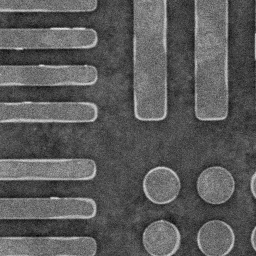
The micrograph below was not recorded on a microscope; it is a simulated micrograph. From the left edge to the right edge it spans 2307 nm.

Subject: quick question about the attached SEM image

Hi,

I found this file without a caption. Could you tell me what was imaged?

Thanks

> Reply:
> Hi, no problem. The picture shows groups of lines, slits or small figures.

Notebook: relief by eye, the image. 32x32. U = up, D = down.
UUUUUUUUUUUUDDDDDUUUUDDDDUUUDDDD
DDDDDDDDDDDDDDDDDUUUUDDDDUUUDDDD
DDDDDDDDDDDDDDDDDUUUUDDDDUUUDDDD
DDDDDDDDDDDDDDDDDUUUUDDDDUUUDDDD
UUUUUUUUUUUUDDDDDUUUDDDDUUUUDDDD
UUUUUUUUUUUUDDDDDUUUUDDDUUUUDDDD
DDDDDDDDDDDDDDDDDUUUUDDDUUUUDDDD
DDDDDDDDDDDDDDDDDUUUUDDDUUUUDDDD
UUUUUUUUUUUUDDDDDUUUUDDDDUUUDDDD
UUUUUUUUUUUUDDDDDUUUUDDDUUUUDDDD
UDUUUUUUDDDDDDDDDUUUUDDDUUUUDDDD
DDDDDDDDDDDDDDDDDUUUUDDDDUUUDDDD
DDDDDDDDDDDDDDDDDUUUUDDDDUUUDDDD
UUUUUUUUUUUUDDDDDUUUUDDDDUUUDDDD
UUUUUUUUUUUUDDDDDUUUDDDDDUUUDDDD
DDDDDDDDDDDDDDDDDDDDDDDDDDDDDDDD
DDDDDDDDDDDDDDDDDDDDDDDDDDDDDDDD
DDDDDDDDDDDDDDDDDDDDDDDDDDDDDDDD
DDDDDDDDDDDDDDDDDDDDDDDDDDDDDDDD
DDDDDDDDDDDDDDDDDDDDDDDDDDDDDDDD
UUUUUUUUUUUUDDDDDDDDDDDDDDDDDDDD
UUUUUUUUUUUUDDDDDDDUUUDDDUUUDDDD
DDDDDDDDDDDDDDDDDDUUUUDDDUUUUDDD
DDDDDDDDDDDDDDDDDDUUUUDDDUUUUDDD
DDDDDDDDDDDDDDDDDDDUUUDDDUUUUDDD
UUUUUUUUUUUUDDDDDDDDDDDDDDDDDDDD
UUUUUUUUUUUUDDDDDDDDDDDDDDDDDDDD
DDDDDDDDDDDDDDDDDDDDDDDDDDDDDDDD
DDDDDDDDDDDDDDDDDDUUUUDDDUUUUDDD
DDDDDDDDDDDDDDDDDDUUUUDDDUUUUDDD
UUUUUUUUUUUUDDDDDDUUUUDDDUUUUDDD
UUUUUUUUUUUUDDDDDDDUUUDDDUUUDDDD